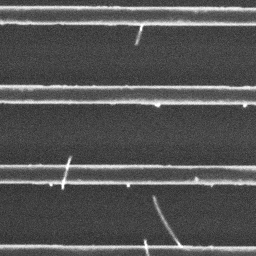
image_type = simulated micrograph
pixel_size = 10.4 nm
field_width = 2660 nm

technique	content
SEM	lines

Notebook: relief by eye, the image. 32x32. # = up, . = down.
................................
################################
################################
................................
................................
................................
................................
................................
................................
................................
................................
################################
################################
................................
................................
................................
................................
................................
................................
................................
................................
################################
################################
................................
................................
................................
................................
................................
................................
................................
................................
################################